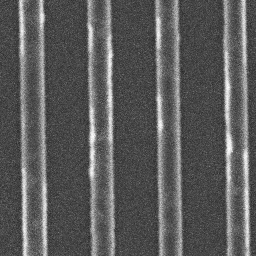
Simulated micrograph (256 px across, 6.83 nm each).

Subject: one or a few lines or trenches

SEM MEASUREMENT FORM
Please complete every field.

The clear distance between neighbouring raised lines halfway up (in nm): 313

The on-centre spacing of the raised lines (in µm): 0.463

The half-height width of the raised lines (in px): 21.2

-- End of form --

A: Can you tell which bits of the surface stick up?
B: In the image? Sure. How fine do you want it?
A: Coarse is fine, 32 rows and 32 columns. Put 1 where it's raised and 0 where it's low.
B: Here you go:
00111000000111000000110000001110
00011000000111000000110000001110
00011000000111000000110000001110
00011000000111000000110000001110
00011000000111000000110000001110
00011000000111000000110000001110
00011000000111000000110000001110
00011000000111000000110000001110
00011000000111000000110000001110
00011000000111000000110000001110
00011000000111000000110000001110
00011000000111000000110000001110
00011000000111000000110000001110
00011000000111000000110000001110
00011000000111000000110000001110
00011000000111000000110000001110
00011000000111000000110000001110
00011100000111000000110000001110
00011100000111000000110000001110
00011100000111000000110000001110
00011100000111000000110000001110
00011100000111000000110000001110
00011100000111000000110000001110
00011100000111000000111000000110
00011100000111000000111000001110
00011100000111000000111000000110
00011100000111000000111000001110
00011100000011000000111000000110
00011100000011000000111000001110
00011100000011000000111000001110
00011100000011000000111000000110
00011100000011000000111000000110